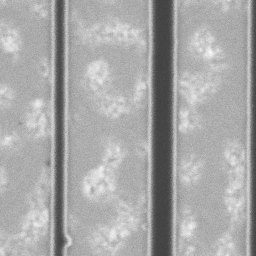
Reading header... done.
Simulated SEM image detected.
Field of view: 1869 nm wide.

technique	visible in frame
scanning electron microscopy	one or a few lines or trenches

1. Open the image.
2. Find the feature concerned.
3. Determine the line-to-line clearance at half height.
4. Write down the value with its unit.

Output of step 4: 556 nanometres